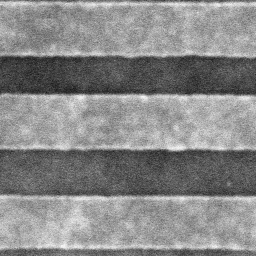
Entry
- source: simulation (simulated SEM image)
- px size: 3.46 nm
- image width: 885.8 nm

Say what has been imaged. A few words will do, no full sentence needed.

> lines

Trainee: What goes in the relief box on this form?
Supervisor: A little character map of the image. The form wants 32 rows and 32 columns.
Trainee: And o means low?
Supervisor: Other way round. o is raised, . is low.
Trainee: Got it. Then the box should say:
oooooooooooooooooooooooo.o.ooooo
oooooooooooooooooooooooooooooooo
oooooooooooooooooooooooooooooooo
oooooooooooooooooooooooooooooooo
oooooooooooooooooooooooooooooooo
oooooooooooooooooooooooooooooooo
oooooooooooooooooooooooooooooooo
................................
................................
................................
................................
................................
oooooooooooooooooooooooooooooooo
oooooooooooooooooooooooooooooooo
oooooooooooooooooooooooooooooooo
oooooooooooooooooooooooooooooooo
oooooooooooooooooooooooooooooooo
oooooooooooooooooooooooooooooooo
oooooooooooooooooooooooooooooooo
................................
................................
................................
................................
................................
................................
oooooooooooooooooooooooooooooooo
oooooooooooooooooooooooooooooooo
oooooooooooooooooooooooooooooooo
oooooooooooooooooooooooooooooooo
oooooooooooooooooooooooooooooooo
oooooooooooooooooooooooooooooooo
................................